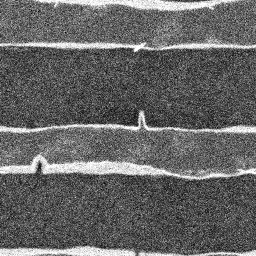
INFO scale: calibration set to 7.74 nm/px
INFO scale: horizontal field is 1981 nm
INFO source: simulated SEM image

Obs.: one or a few lines or trenches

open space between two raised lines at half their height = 615 nm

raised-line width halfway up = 360 nanometres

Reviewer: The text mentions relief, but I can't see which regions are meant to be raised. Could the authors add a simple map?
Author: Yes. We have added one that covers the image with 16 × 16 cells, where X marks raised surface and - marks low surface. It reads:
XXXXXXXXXXXXXXXX
XXXXXXXXXXXXXXXX
XXXXXXXXXXXXXXXX
----------------
----------------
----------------
----------------
----------------
XXXXXXXXXXXXXXXX
XXXXXXXXXXXXXXXX
XX-XXXXXXXXXXXXX
----------------
----------------
----------------
----------------
----------------